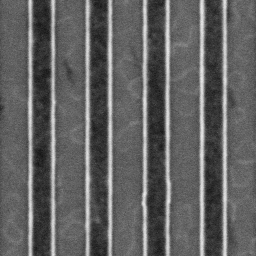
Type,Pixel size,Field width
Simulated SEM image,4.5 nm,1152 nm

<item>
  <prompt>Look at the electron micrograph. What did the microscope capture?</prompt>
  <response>parallel lines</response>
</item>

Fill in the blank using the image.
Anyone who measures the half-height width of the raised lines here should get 111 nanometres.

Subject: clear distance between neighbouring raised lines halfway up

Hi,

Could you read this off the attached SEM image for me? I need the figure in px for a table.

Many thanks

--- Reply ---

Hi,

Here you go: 32.9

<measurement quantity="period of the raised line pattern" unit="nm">257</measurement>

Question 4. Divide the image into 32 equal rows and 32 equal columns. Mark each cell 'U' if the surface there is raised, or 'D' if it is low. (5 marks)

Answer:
DDDDUUUDDDDUUUDDDDUUUDDDDUUUDDDD
DDDDUUUDDDDUUUDDDDUUUDDDDUUUDDDD
DDDDUUUDDDDUUUDDDDUUUDDDDUUUDDDD
DDDDUUUDDDDUUUDDDDUUUDDDDUUUDDDD
DDDDUUUDDDDUUUDDDDUUUDDDDUUUDDDD
DDDDUUUDDDDUUUDDDDUUUDDDDUUUDDDD
DDDDUUUDDDDUUUDDDDUUUDDDDUUUDDDD
DDDDUUUDDDDUUUDDDDUUUDDDDUUUDDDD
DDDDUUUDDDDUUUDDDDUUUDDDDUUUDDDD
DDDDUUUDDDDUUUDDDDUUUDDDDUUUDDDD
DDDDUUUDDDDUUUDDDDUUUDDDDUUUDDDD
DDDDUUUDDDDUUUDDDDUUUDDDDUUUDDDD
DDDDUUUDDDDUUUDDDDUUUDDDDUUUDDDD
DDDDUUUDDDDUUUDDDDUUUDDDDUUUDDDD
DDDDUUUDDDDUUUDDDDUUUDDDDUUUDDDD
DDDDUUUDDDDUUUDDDDUUUDDDDUUUDDDD
DDDDUUUDDDDUUUDDDDUUUDDDDUUUDDDD
DDDDUUUDDDDUUUDDDDUUUDDDDUUUDDDD
DDDDUUUDDDDUUUDDDDUUUDDDDUUUDDDD
DDDDUUUDDDDUUUDDDDUUUDDDDUUUDDDD
DDDDUUUDDDDUUUDDDDUUUDDDDUUUDDDD
DDDDUUUDDDDUUUDDDDUUUDDDDUUUDDDD
DDDDUUUDDDDUUUDDDDUUUDDDDUUUDDDD
DDDDUUUDDDDUUUDDDDUUUDDDDUUUDDDD
DDDDUUUDDDDUUUDDDDUUUDDDDUUUDDDD
DDDDUUUDDDDUUUDDDDUUUDDDDUUUDDDD
DDDDUUUDDDDUUUDDDDUUUDDDDUUUDDDD
DDDDUUUDDDDUUUDDDDUUUDDDDUUUDDDD
DDDDUUUDDDDUUUDDDDUUUDDDDUUUDDDD
DDDDUUUDDDDUUUDDDDUUUDDDDUUUDDDD
DDDDUUUDDDDUUUDDDDUUUDDDDUUUDDDD
DDDDUUUDDDDUUUDDDDUUUDDDDUUUDDDD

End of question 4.